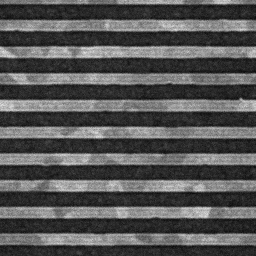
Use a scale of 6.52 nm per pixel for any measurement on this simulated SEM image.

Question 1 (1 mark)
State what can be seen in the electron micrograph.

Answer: parallel lines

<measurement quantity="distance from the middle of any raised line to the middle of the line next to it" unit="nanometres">174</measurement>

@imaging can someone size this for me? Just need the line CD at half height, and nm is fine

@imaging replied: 62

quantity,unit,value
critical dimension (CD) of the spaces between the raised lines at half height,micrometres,0.112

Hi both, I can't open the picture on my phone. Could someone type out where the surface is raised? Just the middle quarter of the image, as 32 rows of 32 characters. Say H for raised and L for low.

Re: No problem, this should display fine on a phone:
LLLLLLLLLLLLLLLLLLLLLLLLLLLLLLLL
LLLLLLLLLLLLLLLLLLLLLLLLLLLLLLLL
LLLLLLLLLLLLLLLLLLLLLLLLLLLLLLLL
HHHHHHHHHHHHHHHHHHHHHHHHHHHHHHHH
HHHHHHHHHHHHHHHHHHHHHHHHHHHHHHHH
LLLLLLLLLLLLLLLLLLLLLLLLLLLLLLLL
LLLLLLLLLLLLLLLLLLLLLLLLLLLLLLLL
LLLLLLLLLLLLLLLLLLLLLLLLLLLLLLLL
LLLLLLLLLLLLLLLLLLLLLLLLLLLLLLLL
HHHHHHHHHHHHHHHHHHHHHHHHHHHHHHHH
HHHHHHHHHHHHHHHHHHHHHHHHHHHHHHHH
HHHHHHHHHHHHHHHHHHHHHHHHHHHHHHHH
LLLLLLLLLLLLLLLLLLLLLLLLLLLLLLLL
LLLLLLLLLLLLLLLLLLLLLLLLLLLLLLLL
LLLLLLLLLLLLLLLLLLLLLLLLLLLLLLLL
LLLLLLLLLLLLLLLLLLLLLLLLLLLLLLLL
HHHHHHHHHHHHHHHHHHHHHHHHHHHHHHHH
HHHHHHHHHHHHHHHHHHHHHHHHHHHHHHHH
LLLLLLLLLLLLLLLLLLLLLLLLLLLLLLLL
LLLLLLLLLLLLLLLLLLLLLLLLLLLLLLLL
LLLLLLLLLLLLLLLLLLLLLLLLLLLLLLLL
LLLLLLLLLLLLLLLLLLLLLLLLLLLLLLLL
LLLLLLLLLLLLLLLLLLLLLLLLLLLLLLLL
HHHHHHHHHHHHHHHHHHHHHHHHHHHHHHHH
HHHHHHHHHHHHHHHHHHHHHHHHHHHHHHHH
LLLLLLLLLLLLLLLLLLLLLLLLLLLLLLLL
LLLLLLLLLLLLLLLLLLLLLLLLLLLLLLLL
LLLLLLLLLLLLLLLLLLLLLLLLLLLLLLLL
LLLLLLLLLLLLLLLLLLLLLLLLLLLLLLLL
HHHHHHHHHHHHHHHHHHHHHHHHHHHHHHHH
HHHHHHHHHHHHHHHHHHHHHHHHHHHHHHHH
HHHHHHHHHHHHHHHHHHHHHHHHHHHHHHHH